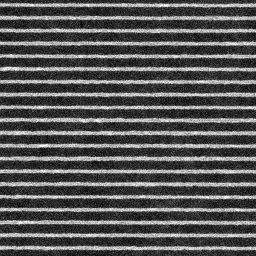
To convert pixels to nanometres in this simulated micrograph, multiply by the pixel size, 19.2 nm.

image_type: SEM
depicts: parallel lines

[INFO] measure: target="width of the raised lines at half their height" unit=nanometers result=52.8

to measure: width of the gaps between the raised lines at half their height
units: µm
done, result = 0.194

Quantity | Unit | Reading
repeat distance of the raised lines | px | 12.8